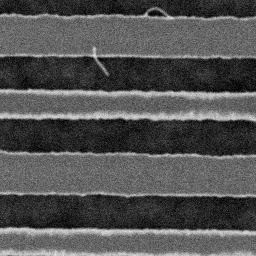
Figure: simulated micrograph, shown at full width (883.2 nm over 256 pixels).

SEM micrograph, lines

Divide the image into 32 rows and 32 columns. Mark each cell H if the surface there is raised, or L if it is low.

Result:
LLLLLLLLLLLLLLLLLLLLLLLLLLLLLLLL
LLLLLLLLLLLLLLLLLLLLLLLLLLLLLLLL
HHHHHHHHHHHHHHHHHHHHHHHHHHHHHHHH
HHHHHHHHHHHHHHHHHHHHHHHHHHHHHHHH
HHHHHHHHHHHHHHHHHHHHHHHHHHHHHHHH
HHHHHHHHHHHHHHHHHHHHHHHHHHHHHHHH
HHHHHHHHHHHHHHHHHHHHHHHHHHHHHHHH
LLLLLLLLLLLLLLLLLLLLLLLLLLLLLLLL
LLLLLLLLLLLLLLLLLLLLLLLLLLLLLLLL
LLLLLLLLLLLLLLLLLLLLLLLLLLLLLLLL
LLLLLLLLLLLLLLLLLLLLLLLLLLLLLLLL
HHHHHHHHHHHHHLLLHHLLLLLLLLLLLLLL
HHHHHHHHHHHHHHHHHHHHHHHHHHHHHHHH
HHHHHHHHHHHHHHHHHHHHHHHHHHHHHHHH
HHHHHHHHHHHHHHHHHHHHHHHHHHHHHHHH
LLLLLLLLLLLLLLLLLLLLLLLLLLLLLLLL
LLLLLLLLLLLLLLLLLLLLLLLLLLLLLLLL
LLLLLLLLLLLLLLLLLLLLLLLLLLLLLLLL
LLLLLLLLLLLLLLLLLLLLLLLLLLLLLLLL
HHHHHHHHHHHHHHHHHHHHHHHHHHLLLHHH
HHHHHHHHHHHHHHHHHHHHHHHHHHHHHHHH
HHHHHHHHHHHHHHHHHHHHHHHHHHHHHHHH
HHHHHHHHHHHHHHHHHHHHHHHHHHHHHHHH
HHHHHHHHHHHHHHHHHHHHHHHHHHHHHHHH
LLLLLLLLLLLLLLLLHLLLLLLLLLLHLHHH
LLLLLLLLLLLLLLLLLLLLLLLLLLLLLLLL
LLLLLLLLLLLLLLLLLLLLLLLLLLLLLLLL
LLLLLLLLLLLLLLLLLLLLLLLLLLLLLLLL
LLLLLLLLLLLLLLLLLLLLLLLLLLLLLLLL
HHHHHHHHHHHHHHHHHHHHHHHHHHHHHHHH
HHHHHHHHHHHHHHHHHHHHHHHHHHHHHHHH
HHHHHHHHHHHHHHHHHHHHHHHHHHHHHHHH